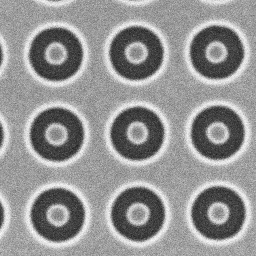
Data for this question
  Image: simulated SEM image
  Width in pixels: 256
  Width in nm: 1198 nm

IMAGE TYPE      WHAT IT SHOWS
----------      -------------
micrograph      an array of small figures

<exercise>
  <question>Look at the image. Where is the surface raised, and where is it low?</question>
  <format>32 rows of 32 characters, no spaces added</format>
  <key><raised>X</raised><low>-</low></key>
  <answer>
XXXXXXXXXXXXXXXXXXXXXXXXXXXXXXXX
XXXXXXXXXXXXXXXXXXXXXXXXXXXXXXXX
XXXXXXXXXXXXXXXXXXXXXXXXXXXXXXXX
XXXXX----XXXXXX----XXXXXX----XXX
XXXX------XXXX------XXXX------XX
XXXX------XXXX-------XXX-------X
-XX---XX---XX---XX---XX---XX---X
-XX---XX---XXX--XX---XXX--XX---X
XXXX------XXXX------XXXX------XX
XXXXX----XXXXXX----XXXXXX----XXX
XXXXXXXXXXXXXXXXXXXXXXXXXXXXXXXX
XXXXXXXXXXXXXXXXXXXXXXXXXXXXXXXX
XXXXXXXXXXXXXXXXXXXXXXXXXXXXXXXX
XXXXXX---XXXXXX----XXXXXX----XXX
XXXX------XXXX------XXXX------XX
XXXX-------XXX---X---XXX-------X
-XX---XX---XXX--XX---XXX--XX---X
-XXX--XX---XXX---X---XXX---X---X
XXXX------XXXX------XXXX------XX
XXXXX-----XXXXX-----XXXXX----XXX
XXXXXXXXXXXXXXXXXXXXXXXXXXXXXXXX
XXXXXXXXXXXXXXXXXXXXXXXXXXXXXXXX
XXXXXXXXXXXXXXXXXXXXXXXXXXXXXXXX
XXXXXX---XXXXXXX---XXXXXXX---XXX
XXXX------XXXX------XXXX------XX
XXXX-------XXX-------XXX---X---X
-XXX--XX---XXX--XX---XXX--XX---X
-XXX--XX---XXX--XX---XXX---X---X
XXXX------XXXX------XXXX------XX
XXXXX-----XXXXX-----XXXXX-----XX
XXXXXXX-XXXXXXXXX-XXXXXXXXXXXXXX
XXXXXXXXXXXXXXXXXXXXXXXXXXXXXXXX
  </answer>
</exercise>